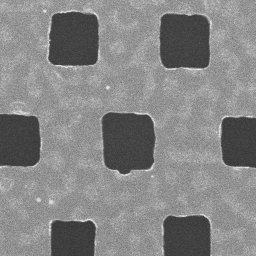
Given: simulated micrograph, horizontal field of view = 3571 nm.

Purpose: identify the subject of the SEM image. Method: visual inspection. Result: holes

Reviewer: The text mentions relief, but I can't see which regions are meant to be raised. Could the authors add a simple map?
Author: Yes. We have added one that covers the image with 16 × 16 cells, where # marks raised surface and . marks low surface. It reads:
################
###...####...###
###...####...###
###...####...###
################
################
################
..####...#####..
...###....####..
...###....####..
#######..#######
################
################
############.###
###...####...###
###...####...###